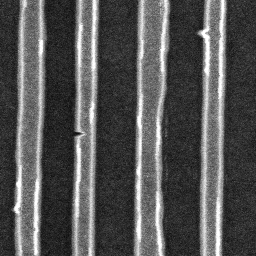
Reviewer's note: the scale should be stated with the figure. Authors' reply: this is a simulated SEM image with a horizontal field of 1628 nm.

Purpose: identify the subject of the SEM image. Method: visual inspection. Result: one or a few lines or trenches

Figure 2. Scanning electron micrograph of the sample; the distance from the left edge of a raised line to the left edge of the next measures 0.388 microns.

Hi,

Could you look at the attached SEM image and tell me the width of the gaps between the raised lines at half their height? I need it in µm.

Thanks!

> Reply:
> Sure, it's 0.255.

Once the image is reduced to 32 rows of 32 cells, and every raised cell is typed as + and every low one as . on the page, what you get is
...++.....++......+++.....++....
...++.....++......+++.....++....
...++.....++......+++.....++....
..+++.....++......+++.....++....
..+++.....++.....++++....+++....
..+++.....++.....++++.....++....
...++.....++.....++++.....++....
...++.....++.....++++.....++....
...++.....++.....++++.....++....
...++.....++.....++++.....++....
..+++.....++.....++++.....++....
..+++.....++.....+++......++....
..+++.....++.....+++......++....
..+++.....++.....+++......++....
..+++.....++.....+++......++....
..+++.....++.....+++.....+++....
..+++.....++.....+++.....+++....
..+++.....++.....+++.....+++....
..+++.....++.....+++.....+++....
..+++.....++.....+++.....+++....
..+++.....++.....+++.....+++....
..+++....+++.....+++.....+++....
..+++....+++.....+++.....+++....
..+++....+++.....+++.....+++....
..+++....+++.....+++.....+++....
..+++....+++.....+++.....+++....
..+++....+++.....+++.....+++....
..+++....+++.....+++.....++.....
..+++....+++.....+++.....++.....
..+++....+++.....+++.....+++....
..+++....+++.....+++.....++.....
..+++....+++.....+++.....+++....